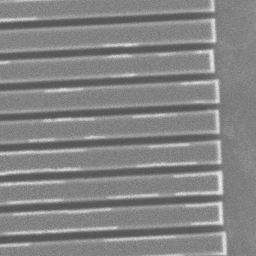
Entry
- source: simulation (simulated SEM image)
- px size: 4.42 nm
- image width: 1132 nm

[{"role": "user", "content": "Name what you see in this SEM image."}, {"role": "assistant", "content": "parallel lines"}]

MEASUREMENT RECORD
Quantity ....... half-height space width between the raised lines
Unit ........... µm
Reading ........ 0.0353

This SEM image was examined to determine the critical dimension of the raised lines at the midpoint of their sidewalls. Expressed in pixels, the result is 22.8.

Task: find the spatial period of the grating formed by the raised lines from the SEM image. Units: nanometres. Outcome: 135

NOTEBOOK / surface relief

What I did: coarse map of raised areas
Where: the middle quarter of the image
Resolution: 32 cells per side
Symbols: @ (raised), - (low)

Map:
@@@@@@@@@@@@@@@@@@@@@@@@@@@@@@@@
@@@@@@@@@@@@@@@@@@@@@@@@@@@@@@@@
@@@@@@@@@@@@@@@@@@@@@@@@@@@@@---
@@@@@@@@@@----------------------
--------------------------------
-----------@@@@@@@@@@@@@@@@@@@@@
@@@@@@@@@@@@@@@@@@@@@@@@@@@@@@@@
@@@@@@@@@@@@@@@@@@@@@@@@@@@@@@@@
@@@@@@@@@@@@@@@@@@@@@@@@@@@@@@@@
@@@@@@@@@@@@@@@@@@@@@@@@@@@@@@@@
@@@@@@@@@@@@@@@@@@@-------------
--------------------------------
-----------------------@@@@@@@@@
---@@@@@@@@@@@@@@@@@@@@@@@@@@@@@
@@@@@@@@@@@@@@@@@@@@@@@@@@@@@@@@
@@@@@@@@@@@@@@@@@@@@@@@@@@@@@@@@
@@@@@@@@@@@@@@@@@@@@@@@@@@@@@@@@
@@@@@@@@@@@@@@@@@@@@@@@@@@@@@@@@
@@@@@@@@@@@@@-------------------
--------------------------------
-----------------@@@@@@@@@@@@@@@
@@@@@@@@@@@@@@@@@@@@@@@@@@@@@@@@
@@@@@@@@@@@@@@@@@@@@@@@@@@@@@@@@
@@@@@@@@@@@@@@@@@@@@@@@@@@@@@@@@
@@@@@@@@@@@@@@@@@@@@@@@@@@@@@@@@
@@@@@@@@@@@@@@@@@@@@@@-@@@@-----
@@@@@@@-------------------------
------------------------------@@
-----------@@@@@@@@@@@@@@@@@@@@@
@@@@@@@@@@@@@@@@@@@@@@@@@@@@@@@@
@@@@@@@@@@@@@@@@@@@@@@@@@@@@@@@@
@@@@@@@@@@@@@@@@@@@@@@@@@@@@@@@@